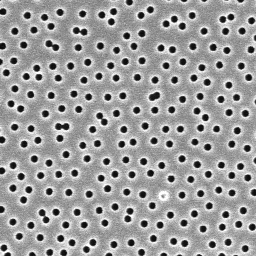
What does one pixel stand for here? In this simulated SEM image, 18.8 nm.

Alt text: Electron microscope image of a regular array of holes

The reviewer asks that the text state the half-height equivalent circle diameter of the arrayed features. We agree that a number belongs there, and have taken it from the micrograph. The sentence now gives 142 nm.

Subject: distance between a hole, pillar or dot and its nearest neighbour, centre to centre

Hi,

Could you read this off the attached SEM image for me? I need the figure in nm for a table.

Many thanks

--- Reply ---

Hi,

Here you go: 271